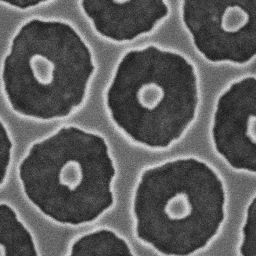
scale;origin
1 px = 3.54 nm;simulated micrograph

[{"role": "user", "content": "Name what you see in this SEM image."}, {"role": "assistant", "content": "ring-shaped grooves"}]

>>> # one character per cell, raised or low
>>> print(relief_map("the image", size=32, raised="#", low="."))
#....#####...........##.........
###########..........##.....###.
####.######.........###.....###.
###......###.......####.....##..
##........###....#######........
##.........#############........
#..........#####......###.......
#...##.....####........###.....#
....###.....###.........########
....###....###..........########
#..........###...........####...
#..........##....###.....###....
#.........###....###.....##.....
##.......#####....#.....###.....
####....######..........###.....
###############.........###....#
.######....#####.......####....#
.#####.......####.....#####.....
.###.........##############.....
.##...........##############....
.##.....##....#######.....###...
.##.....##....####.........#####
###.....##....####.........#####
###...........###...........####
###...........###.....#.....####
####..........###....###....###.
..###........####....###....###.
..#####.....#####...........###.
...##############..........###..
....#######....##..........###..
....#####.......###.......####..
#....####.......####....######..